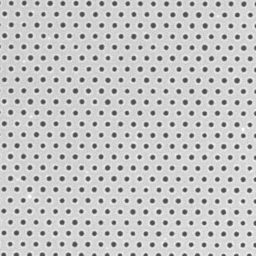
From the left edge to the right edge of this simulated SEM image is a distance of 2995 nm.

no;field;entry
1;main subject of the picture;a regular array of holes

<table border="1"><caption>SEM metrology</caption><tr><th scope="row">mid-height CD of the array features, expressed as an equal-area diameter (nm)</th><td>64.7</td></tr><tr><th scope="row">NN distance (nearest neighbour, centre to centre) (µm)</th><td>0.146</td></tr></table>